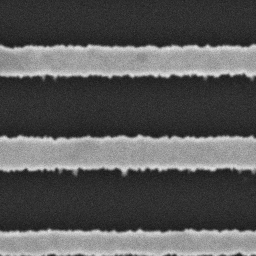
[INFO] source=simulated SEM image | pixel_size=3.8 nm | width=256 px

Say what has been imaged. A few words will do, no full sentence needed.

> lines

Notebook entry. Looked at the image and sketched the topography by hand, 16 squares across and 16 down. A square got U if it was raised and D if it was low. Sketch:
DDDDDDDDDDDDDDDD
DDDDDDDDDDDDDDDD
DDDDDDDDDDDDDDDD
UUUUUUUUUUUUUUUU
UUUUUUUUUUUUUUUU
DDDDDDDDDDDDDDDD
DDDDDDDDDDDDDDDD
DDDDDDDDDDDDDDDD
DDDDDDDDDDDDDDDD
UUUUUUUUUUUUUUUU
UUUUUUUUUUUUUUUU
DDDDDDDDDDDDDDDD
DDDDDDDDDDDDDDDD
DDDDDDDDDDDDDDDD
UUUUUUUUUUUUUUUU
UUUUUUUUUUUUUUUU